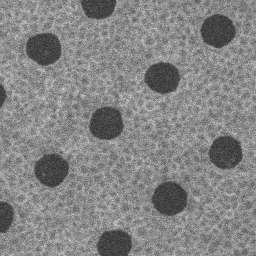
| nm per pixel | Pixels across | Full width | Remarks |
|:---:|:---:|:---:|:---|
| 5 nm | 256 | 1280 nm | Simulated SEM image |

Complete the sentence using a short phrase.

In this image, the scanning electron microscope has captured holes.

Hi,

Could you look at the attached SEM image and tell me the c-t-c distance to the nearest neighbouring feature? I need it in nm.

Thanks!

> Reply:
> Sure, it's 362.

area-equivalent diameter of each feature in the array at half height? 177 nanometers